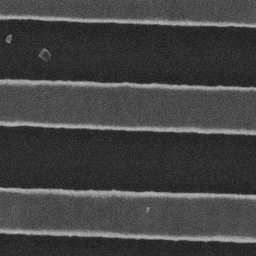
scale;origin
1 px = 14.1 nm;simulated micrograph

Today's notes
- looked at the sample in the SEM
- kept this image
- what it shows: lines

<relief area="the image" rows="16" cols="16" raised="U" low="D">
UUUUUUUUUUUUUUUU
DDDDDDDDDDUUUUUU
DDDDDDDDDDDDDDDD
DDDDDDDDDDDDDDDD
DDDDDDDDDDDDDDDD
UUUUUUUUUUUUUUUU
UUUUUUUUUUUUUUUU
UUUUUUUUUUUUUUUU
DDDDDDDDDDDDDDDD
DDDDDDDDDDDDDDDD
DDDDDDDDDDDDDDDD
DDDDDDDDDDDDDDDD
UUUUUUUUUUUUUUUU
UUUUUUUUUUUUUUUU
UUUUUUUUUUUUUUUU
DDDDDDDDDDDDDDDD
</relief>